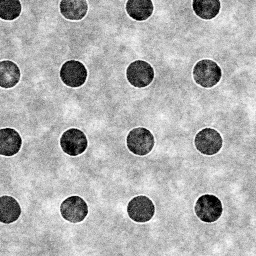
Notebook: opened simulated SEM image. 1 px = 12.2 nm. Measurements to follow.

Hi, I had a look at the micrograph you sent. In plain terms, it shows a regular array of holes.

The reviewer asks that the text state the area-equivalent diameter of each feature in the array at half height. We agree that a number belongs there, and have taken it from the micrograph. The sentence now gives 349 nanometres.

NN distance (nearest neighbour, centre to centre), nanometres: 814